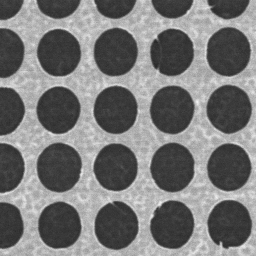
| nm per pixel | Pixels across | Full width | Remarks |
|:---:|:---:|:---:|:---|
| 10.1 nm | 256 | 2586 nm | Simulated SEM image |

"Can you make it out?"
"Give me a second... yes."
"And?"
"a regular array of holes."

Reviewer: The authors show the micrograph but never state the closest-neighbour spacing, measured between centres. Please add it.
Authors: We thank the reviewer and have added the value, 572 nm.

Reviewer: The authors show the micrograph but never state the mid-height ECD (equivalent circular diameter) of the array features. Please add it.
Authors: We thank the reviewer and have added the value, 470 nm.